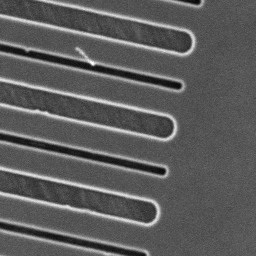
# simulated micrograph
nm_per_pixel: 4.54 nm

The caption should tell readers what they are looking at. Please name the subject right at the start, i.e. parallel lines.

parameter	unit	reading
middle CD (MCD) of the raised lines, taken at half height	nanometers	126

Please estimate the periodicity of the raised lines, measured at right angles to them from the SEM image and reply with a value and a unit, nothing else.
198 nanometers